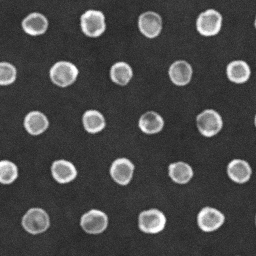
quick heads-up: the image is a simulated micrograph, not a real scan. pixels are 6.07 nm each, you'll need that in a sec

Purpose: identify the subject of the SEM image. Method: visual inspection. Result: a regular array of raised bodies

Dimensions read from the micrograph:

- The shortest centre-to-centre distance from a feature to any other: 342 nm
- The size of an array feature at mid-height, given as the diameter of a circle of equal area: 140 nm